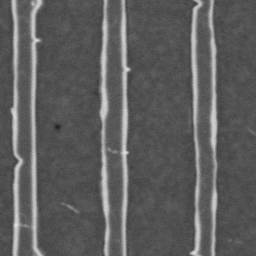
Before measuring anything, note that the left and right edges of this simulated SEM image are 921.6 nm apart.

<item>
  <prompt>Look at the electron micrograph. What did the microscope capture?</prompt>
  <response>one or a few lines or trenches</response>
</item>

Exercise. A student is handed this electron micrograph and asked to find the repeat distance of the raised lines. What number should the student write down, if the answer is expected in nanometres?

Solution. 324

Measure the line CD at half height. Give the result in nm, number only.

69.8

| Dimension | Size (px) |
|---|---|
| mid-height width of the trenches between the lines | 69.5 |